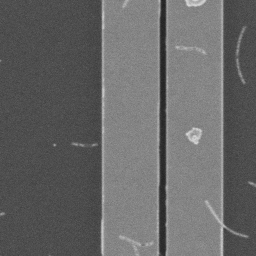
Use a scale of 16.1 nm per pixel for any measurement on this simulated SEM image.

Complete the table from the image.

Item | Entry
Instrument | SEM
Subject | lines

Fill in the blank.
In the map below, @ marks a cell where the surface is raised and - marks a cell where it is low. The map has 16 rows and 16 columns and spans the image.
------@@@@@@@@--
------@@@@@@@@--
------@@@@@@@@--
------@@@@@@@@--
------@@@@@@@@--
------@@@@@@@@--
------@@@@@@@@--
------@@@@@@@@--
------@@@@@@@@--
------@@@@@@@@--
------@@@@@@@@--
------@@@@@@@@--
------@@@@@@@@--
------@@@@@@@@--
------@@@@@@@@--
------@@@@@@@@--